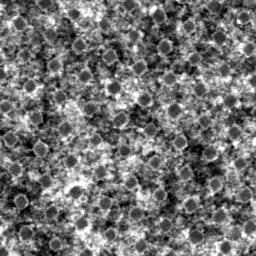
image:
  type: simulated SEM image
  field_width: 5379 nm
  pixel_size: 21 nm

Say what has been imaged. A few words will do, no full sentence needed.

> a regular array of raised bodies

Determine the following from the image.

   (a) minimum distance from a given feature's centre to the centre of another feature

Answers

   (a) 661 nanometres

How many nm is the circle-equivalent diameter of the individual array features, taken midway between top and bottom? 286